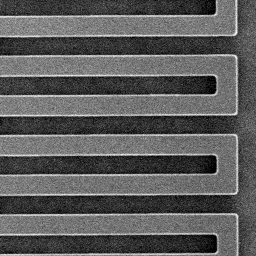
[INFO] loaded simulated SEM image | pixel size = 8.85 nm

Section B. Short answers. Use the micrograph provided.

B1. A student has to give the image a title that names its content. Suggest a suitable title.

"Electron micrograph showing groups of lines, slits or small figures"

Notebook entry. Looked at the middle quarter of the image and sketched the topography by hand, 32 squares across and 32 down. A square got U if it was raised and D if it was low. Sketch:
UUUUUUUUUUUUUUUUUUUUUUUUUUUUUUUU
UUUUUUUUUUUUUUUUUUUUUUUUUUUUUUUU
UUUUUUUUUUUUUUUUUUUUUUUUUUUUUUUU
DDDDDDDDDDDDDDDDDDDDDDDDDDDDDDDD
DDDDDDDDDDDDDDDDDDDDDDDDDDDDDDDD
DDDDDDDDDDDDDDDDDDDDDDDDDDDDDDDD
DDDDDDDDDDDDDDDDDDDDDDDDDDDDDDDD
DDDDDDDDDDDDDDDDDDDDDDDDDDDDDDDD
UUUUUUUUUUUUUUUUUUUUUUUUUUUUUUUU
UUUUUUUUUUUUUUUUUUUUUUUUUUUUUUUU
UUUUUUUUUUUUUUUUUUUUUUUUUUUUUUUU
UUUUUUUUUUUUUUUUUUUUUUUUUUUUUUUU
UUUUUUUUUUUUUUUUUUUUUUUUUUUUUUUU
DDDDDDDDDDDDDDDDDDDDDDDDDDDDDDDD
DDDDDDDDDDDDDDDDDDDDDDDDDDDDDDDD
DDDDDDDDDDDDDDDDDDDDDDDDDDDDDDDD
DDDDDDDDDDDDDDDDDDDDDDDDDDDDDDDD
DDDDDDDDDDDDDDDDDDDDDDDDDDDDDDDD
UUUUUUUUUUUUUUUUUUUUUUUUUUUUUUUU
UUUUUUUUUUUUUUUUUUUUUUUUUUUUUUUU
UUUUUUUUUUUUUUUUUUUUUUUUUUUUUUUU
UUUUUUUUUUUUUUUUUUUUUUUUUUUUUUUU
UUUUUUUUUUUUUUUUUUUUUUUUUUUUUUUU
DDDDDDDDDDDDDDDDDDDDDDDDDDDDDDDD
DDDDDDDDDDDDDDDDDDDDDDDDDDDDDDDD
DDDDDDDDDDDDDDDDDDDDDDDDDDDDDDDD
DDDDDDDDDDDDDDDDDDDDDDDDDDDDDDDD
DDDDDDDDDDDDDDDDDDDDDDDDDDDDDDDD
UUUUUUUUUUUUUUUUUUUUUUUUUUUUUUUU
UUUUUUUUUUUUUUUUUUUUUUUUUUUUUUUU
UUUUUUUUUUUUUUUUUUUUUUUUUUUUUUUU
UUUUUUUUUUUUUUUUUUUUUUUUUUUUUUUU